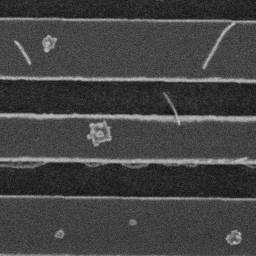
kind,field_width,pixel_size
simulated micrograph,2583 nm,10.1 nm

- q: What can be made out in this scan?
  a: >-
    lines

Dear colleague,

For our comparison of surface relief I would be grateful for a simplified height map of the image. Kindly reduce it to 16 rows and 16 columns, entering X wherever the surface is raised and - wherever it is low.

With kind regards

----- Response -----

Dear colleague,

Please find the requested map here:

----------------
XXXXXXXXXXXXXXXX
XXXXXXXXXXXXXXXX
XXXXXXXXXXXXXXXX
XXXXXXXXXXXXXXXX
----------------
----------------
XXXXXXXXXXXXXXXX
XXXXXXXXXXXXXXXX
XXXXXXXXXXXXXXXX
----------------
----------------
XXXXXXXXXXXXXXXX
XXXXXXXXXXXXXXXX
XXXXXXXXXXXXXXXX
XXXXXXXXXXXXXXXX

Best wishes